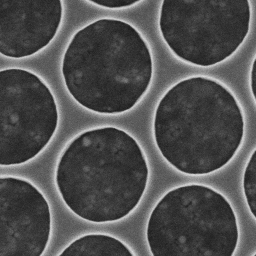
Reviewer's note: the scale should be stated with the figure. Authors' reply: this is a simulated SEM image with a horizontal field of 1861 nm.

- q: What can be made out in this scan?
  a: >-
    holes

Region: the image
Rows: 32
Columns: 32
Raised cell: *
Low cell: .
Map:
........****.....***...........*
........************...........*
........****..******...........*
.......****......***...........*
.......**.........**...........*
......***.........***.........**
....****...........***.......***
********...........****.....****
********...........*************
....****...........************.
.....***...........***......***.
......***.........***........***
.......***.......***.........***
.......****.....****..........**
.......************...........**
.......************...........**
.......****....****...........**
......***........***..........**
.....***.........***..........**
....****..........**.........***
..*****...........***.......***.
*******...........*****...*****.
...****...........************..
....***...........****....****..
.....***..........***.......***.
......**.........***.........**.
......***.......***..........***
......*****....****..........***
......************............**
......*****..*****............**
......***......****...........**
.....***........***..........***